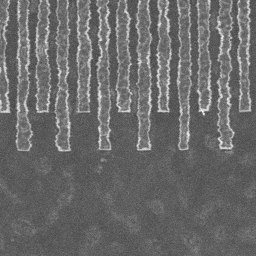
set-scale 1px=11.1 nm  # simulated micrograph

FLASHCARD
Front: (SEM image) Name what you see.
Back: parallel lines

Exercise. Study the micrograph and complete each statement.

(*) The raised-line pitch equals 224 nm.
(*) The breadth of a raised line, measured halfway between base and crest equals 121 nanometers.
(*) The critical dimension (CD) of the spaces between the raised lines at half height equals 104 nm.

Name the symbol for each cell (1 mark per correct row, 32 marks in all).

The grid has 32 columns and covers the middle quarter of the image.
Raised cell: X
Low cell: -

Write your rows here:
X--XXX--XXX---XX---XXX--XX---XXX
X---XX--XXX---XX---XXX--XX---XXX
X---XXX-XXX---XX---XXX-XXX--XXXX
X---XX--XXX---XX---XXX-XXX--XXX-
X--XXX---XX--XXX--XXXX-XXX---XXX
X---XX---XX--XXX--XXXX-XXX---XXX
X--XXX---XX--XXX---XXX--XX---XX-
X--XXX---XX--XXXX--XXX--XX---XX-
X---XX---XX--XXX---XXX--XX---XX-
X---XX---XXX-XXXX--XXX--XX---XX-
X---XX---XXX-XXX---XXX--XX---XX-
X---XX---XX---XXX--XXX--XX---XX-
X--------XX-------XXX--------XX-
X--------XX--------XX--------XX-
X--------XX--------XX--------XX-
X--------XX--------XX--------XX-
X--------XX--------XX--------XX-
X--------XX--------XX--------XX-
X--------XX--------XX--------XX-
X--------XX--------XX--------XX-
X--------XX-------XXXX-------XX-
X-------------------------------
--------------------------------
--------------------------------
--------------------------------
--------------------------------
--------------------------------
--------------------------------
--------------------------------
--------------------------------
--------------------------------
--------------------------------